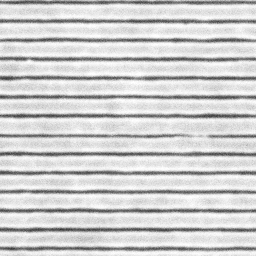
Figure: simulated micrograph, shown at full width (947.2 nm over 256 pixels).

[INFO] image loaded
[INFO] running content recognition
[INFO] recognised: parallel lines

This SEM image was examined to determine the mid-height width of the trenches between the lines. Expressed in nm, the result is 18.5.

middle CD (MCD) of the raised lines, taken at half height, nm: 52.7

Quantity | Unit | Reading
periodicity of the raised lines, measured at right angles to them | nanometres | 70.1